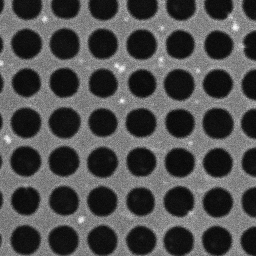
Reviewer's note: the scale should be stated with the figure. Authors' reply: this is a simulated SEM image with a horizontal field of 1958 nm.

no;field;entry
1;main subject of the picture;a regular array of holes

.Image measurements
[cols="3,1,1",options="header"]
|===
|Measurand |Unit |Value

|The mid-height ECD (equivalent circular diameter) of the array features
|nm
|236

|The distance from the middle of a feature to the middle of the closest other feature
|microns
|0.293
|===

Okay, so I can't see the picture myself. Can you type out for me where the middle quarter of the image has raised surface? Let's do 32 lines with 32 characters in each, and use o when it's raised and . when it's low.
oooooooooooooooooooooooooooooooo
..oooooo....ooooooo..oooooo...oo
...oooo......oooo.....oooo......
....oo.......ooo.......oo.......
....oo........oo.......oo.......
....oo........oo.......oo.......
...ooo.......ooo.......oo.......
...oooo......oooo.....oooo......
.oooooooo..oooooooo.ooooooo....o
oooooooooooooooooooooooooooooooo
oooooooooooooooooooooooooooooooo
...ooooo...oooooo....oooooo....o
....ooo......ooo......oooo......
....oo.......oo........oo.......
....oo.......oo........oo.......
....oo.......oo........oo.......
....oo.......ooo.......ooo......
...oooo.....oooo......oooo......
..oooooooooooooooooooooooooo..oo
oooooooooooooooooooooooooooooooo
.ooooooooooooooooooooooooooooooo
...oooo.....ooooo.....oooo.....o
...ooo.......ooo.......ooo......
....oo.......oo........oo.......
....oo........o........oo.......
....oo.......ooo.......oo.......
...ooo.......ooo.......ooo......
..ooooo.....ooooo.....oooo.....o
ooooooooo.ooooooooooooooooooo.oo
oooooooooooooooooooooooooooooooo
.oooooooo.oooooooooooooooooo..oo
...oooo.....ooooo.....oooo.....o